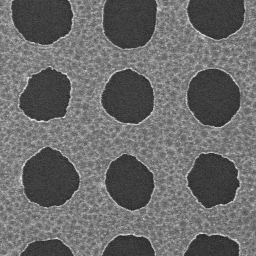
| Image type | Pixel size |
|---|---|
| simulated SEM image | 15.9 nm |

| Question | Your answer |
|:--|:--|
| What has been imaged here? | holes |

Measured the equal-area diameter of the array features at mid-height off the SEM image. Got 849 nm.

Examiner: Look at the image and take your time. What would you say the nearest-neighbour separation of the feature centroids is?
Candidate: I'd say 1310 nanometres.